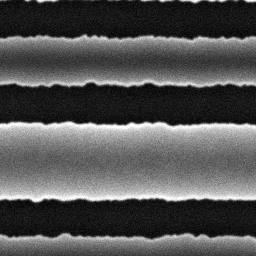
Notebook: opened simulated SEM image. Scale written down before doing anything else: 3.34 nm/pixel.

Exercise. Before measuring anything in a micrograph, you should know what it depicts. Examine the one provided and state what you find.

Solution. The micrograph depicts lines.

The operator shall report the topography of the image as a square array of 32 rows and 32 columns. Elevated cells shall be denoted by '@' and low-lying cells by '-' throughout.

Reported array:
--------------------------------
--------------------------------
--------------------------------
--------------------------------
-----@----@-------@-------------
@@@@@@@@@@@@@@@@@@@@@@@@@@@@@@@@
@@@@@@@@@@@@@@@@@@@@@@@@@@@@@@@@
@@@@@@@@@@@@@@@@@@@@@@@@@@@@@@@@
@@@@@@@@@@@@@@@@@@@@@@@@@@@@@@@@
@@@@@@@@@@@@@@@@@@@@@@@@@@@@@@@@
--@@@@@-@@@-@--@@@-@@@@@@@@--@@@
--------------------------------
--------------------------------
--------------------------------
--------------------------------
-@@@@--@@-------@-@@@-----------
@@@@@@@@@@@@@@@@@@@@@@@@@@@@@@@@
@@@@@@@@@@@@@@@@@@@@@@@@@@@@@@@@
@@@@@@@@@@@@@@@@@@@@@@@@@@@@@@@@
@@@@@@@@@@@@@@@@@@@@@@@@@@@@@@@@
@@@@@@@@@@@@@@@@@@@@@@@@@@@@@@@@
@@@@@@@@@@@@@@@@@@@@@@@@@@@@@@@@
@@@@@@@@@@@@@@@@@@@@@@@@@@@@@@@@
@@@@@@@@@@@@@@@@@@@@@@@@@@@@@@@@
@@@@@@@@@@@@@@@@@@@@@@@@@@@@@@@@
--------------------------------
--------------------------------
--------------------------------
--------------------------------
@---@--@@-----------@@@@-@--@---
@@@@@@@@@@@@@@@@@@@@@@@@@@@@@@@@
@@@@@@@@@@@@@@@@@@@@@@@@@@@@@@@@